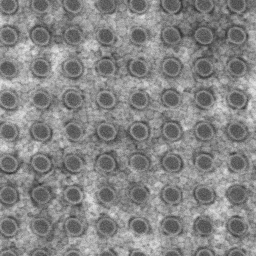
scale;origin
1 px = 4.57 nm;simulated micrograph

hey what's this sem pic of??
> a regular array of raised bodies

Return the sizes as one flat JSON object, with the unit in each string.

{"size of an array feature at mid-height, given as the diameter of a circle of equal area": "76.8 nm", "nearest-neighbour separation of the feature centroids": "144 nm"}